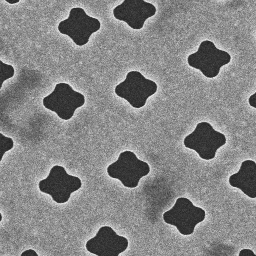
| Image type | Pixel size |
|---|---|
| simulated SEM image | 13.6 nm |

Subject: a regular array of holes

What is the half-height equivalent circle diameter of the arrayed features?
474 nanometres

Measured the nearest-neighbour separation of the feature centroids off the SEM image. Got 0.992 micrometres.